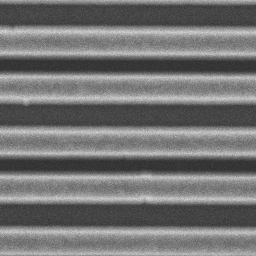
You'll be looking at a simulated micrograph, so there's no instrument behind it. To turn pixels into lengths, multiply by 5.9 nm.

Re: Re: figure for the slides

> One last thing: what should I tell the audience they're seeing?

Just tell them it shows parallel lines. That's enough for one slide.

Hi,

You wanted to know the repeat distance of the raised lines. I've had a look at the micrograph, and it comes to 285 nanometers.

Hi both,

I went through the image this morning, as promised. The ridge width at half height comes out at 0.166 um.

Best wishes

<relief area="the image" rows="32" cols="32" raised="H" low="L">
LLLLLLLLLLLLLLLLLLLLLLLLLLLLLLLL
LLLLLLLLLLLLLLLLLLLLLLLLLLLLLLLL
LLLLLLLLLLLLLLLLLLLLLLLLLLLLLLLL
LLLLLLLLLLLLLLLLLLLLLLLLLLLLLLLL
HHHHHHHHHHHHHHHHHHHHHHHHHHHHHHHH
HHHHHHHHHHHHHHHHHHHHHHHHHHHHHHHH
HHHHHHHHHHHHHHHHHHHHHHHHHHHHHHHH
LLLLLLLLLLLLLLLLLLLLLLLLLLLLLLLL
LLLLLLLLLLLLLLLLLLLLLLLLLLLLLLLL
HHHHHHHHHHHHHHHHHHHHHHHHHHHHHHHH
HHHHHHHHHHHHHHHHHHHHHHHHHHHHHHHH
HHHHHHHHHHHHHHHHHHHHHHHHHHHHHHHH
HHHHHHHHHHHHHHHHHHHHHHHHHHHHHHHH
LLLLLLLLLLLLLLLLLLLLLLLLLLLLLLLL
LLLLLLLLLLLLLLLLLLLLLLLLLLLLLLLL
LLLLLLLLLLLLLLLLLLLLLLLLLLLLLLLL
HHHHHHHHHHHHHHHHHHHHHHHHHHHHHHHH
HHHHHHHHHHHHHHHHHHHHHHHHHHHHHHHH
HHHHHHHHHHHHHHHHHHHHHHHHHHHHHHHH
HHHHHHHHHHHHHHHHHHHHHHHHHHHHHHHH
LLLLLLLLLLLLLLLLLLLLLLLLLLLLLLLL
LLLLLLLLLLLLLLLLLLLLLLLLLLLLLLLL
HHHHHHHHHHHHHHHHHHHHHHHHHHHHHHHH
HHHHHHHHHHHHHHHHHHHHHHHHHHHHHHHH
HHHHHHHHHHHHHHHHHHHHHHHHHHHHHHHH
LLLLLLLLLLLLLLLLLLLLLLLLLLLLLLLL
LLLLLLLLLLLLLLLLLLLLLLLLLLLLLLLL
LLLLLLLLLLLLLLLLLLLLLLLLLLLLLLLL
LLLLLLLLLLLLLLLLLLLLLLLLLLLLLLLL
HHHHHHHHHHHHHHHHHHHHHHHHHHHHHHHH
HHHHHHHHHHHHHHHHHHHHHHHHHHHHHHHH
HHHHHHHHHHHHHHHHHHHHHHHHHHHHHHHH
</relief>